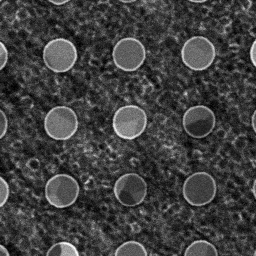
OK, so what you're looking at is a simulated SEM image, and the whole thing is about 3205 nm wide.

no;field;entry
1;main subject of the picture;a regular array of raised bodies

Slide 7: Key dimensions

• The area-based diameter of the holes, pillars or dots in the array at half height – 0.404 um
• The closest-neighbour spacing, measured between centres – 847 nm